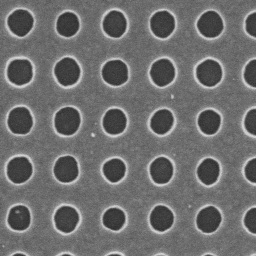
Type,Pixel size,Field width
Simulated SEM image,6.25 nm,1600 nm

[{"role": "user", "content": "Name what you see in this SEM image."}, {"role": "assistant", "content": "a regular array of holes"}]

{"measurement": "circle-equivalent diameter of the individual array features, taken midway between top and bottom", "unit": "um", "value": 0.169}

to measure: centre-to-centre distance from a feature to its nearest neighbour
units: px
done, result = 47.2